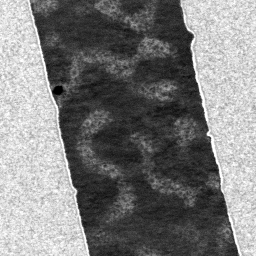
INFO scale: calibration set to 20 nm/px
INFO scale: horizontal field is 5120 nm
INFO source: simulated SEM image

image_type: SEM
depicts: one or a few lines or trenches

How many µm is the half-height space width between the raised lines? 2.93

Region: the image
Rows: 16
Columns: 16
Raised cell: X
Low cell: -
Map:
XX---------XXXXX
XX----------XXXX
XX----------XXXX
XXX---------XXXX
XXX---------XXXX
XXX---------XXXX
XXX----------XXX
XXXX---------XXX
XXXX---------XXX
XXXX---------XXX
XXXX----------XX
XXXXX---------XX
XXXXX---------XX
XXXXX---------XX
XXXXX----------X
XXXXX----------X